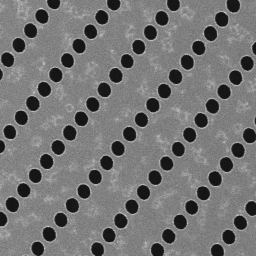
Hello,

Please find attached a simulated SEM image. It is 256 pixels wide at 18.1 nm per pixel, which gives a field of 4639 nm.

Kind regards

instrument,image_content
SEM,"a regular array of holes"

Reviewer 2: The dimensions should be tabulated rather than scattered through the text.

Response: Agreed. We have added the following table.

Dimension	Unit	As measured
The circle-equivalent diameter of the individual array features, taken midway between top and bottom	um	0.254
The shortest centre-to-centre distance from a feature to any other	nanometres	332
